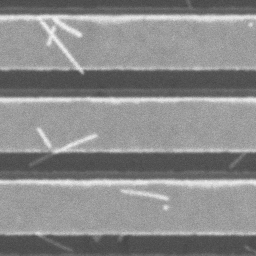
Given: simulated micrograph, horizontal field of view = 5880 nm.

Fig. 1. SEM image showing lines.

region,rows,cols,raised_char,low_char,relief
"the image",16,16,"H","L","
LLLLLLLLLLLLLLLL
HHHHHHHHHHHHHHHH
HHHHHHHHHHHHHHHH
HHHHHHHHHHHHHHHH
LLLLLLLLLLLLLLLL
LLLLLLLLLLLLLLLL
HHHHHHHHHHHHHHHH
HHHHHHHHHHHHHHHH
HHHHHHHHHHHHHHHH
LLLHLLLLLLLLLLLL
LLLLLLLLLLLLLLLL
HHHHHHHHHHHHHHHH
HHHHHHHHHHHHHHHH
HHHHHHHHHHHHHHHH
HHHHHHHHHHHHHHHH
LLLLLLLLLLLLLLLL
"